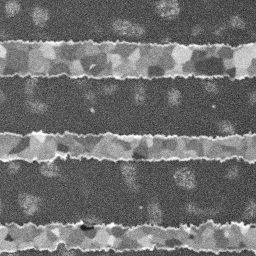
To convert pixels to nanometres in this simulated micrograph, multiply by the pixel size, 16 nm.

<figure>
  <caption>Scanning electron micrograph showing one or a few lines or trenches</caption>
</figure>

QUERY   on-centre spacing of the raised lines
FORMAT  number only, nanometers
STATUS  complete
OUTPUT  1410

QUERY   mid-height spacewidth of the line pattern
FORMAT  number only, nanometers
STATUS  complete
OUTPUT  987